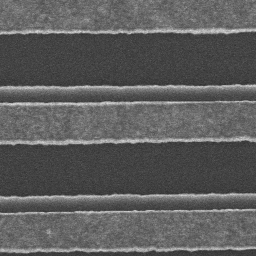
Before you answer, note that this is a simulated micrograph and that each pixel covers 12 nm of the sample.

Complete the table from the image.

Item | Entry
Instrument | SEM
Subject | lines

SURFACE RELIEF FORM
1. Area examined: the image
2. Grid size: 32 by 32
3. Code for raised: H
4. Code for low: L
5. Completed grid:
HHHHHHHHHHHHHHHHHHHHHHHHHHHHHHHH
HHHHHHHHHHHHHHHHHHHHHHHHHHHHHHHH
HHHHHHHHHHHHHHHHHHHHHHHHHHHHHHHH
HHHHHHHHHHHHHHHHHHHHHHHHHHHHHHHH
LLLLLLLLLLLLLLLLLLLLLLLLLLLLLLLL
LLLLLLLLLLLLLLLLLLLLLLLLLLLLLLLL
LLLLLLLLLLLLLLLLLLLLLLLLLLLLLLLL
LLLLLLLLLLLLLLLLLLLLLLLLLLLLLLLL
LLLLLLLLLLLLLLLLLLLLLLLLLLLLLLLL
LLLLLLLLLLLLLLLLLLLLLLLLLLLLLLLL
LLLLLLLLLLLLLLLLLLLLLLLLLLLLLLLL
HHHHHHHHHHHHHHHHHHHHHHHHHHHHHHHH
HHHHHHHHHHHHHHHHHHHHHHHHHHHHHHHH
HHHHHHHHHHHHHHHHHHHHHHHHHHHHHHHH
HHHHHHHHHHHHHHHHHHHHHHHHHHHHHHHH
HHHHHHHHHHHHHHHHHHHHHHHHHHHHHHHH
HHHHHHHHHHHHHHHHHHHHHHHHHHHHHHHH
HHHHHHHHHHHHHHHHHHHHHHHHHHHHHHLH
LLLLLLLLLLLLLLLLLLLLLLLLLLLLLLLL
LLLLLLLLLLLLLLLLLLLLLLLLLLLLLLLL
LLLLLLLLLLLLLLLLLLLLLLLLLLLLLLLL
LLLLLLLLLLLLLLLLLLLLLLLLLLLLLLLL
LLLLLLLLLLLLLLLLLLLLLLLLLLLLLLLL
LLLLLLLLLLLLLLLLLLLLLLLLLLLLLLLL
LLLLLLLLLLLHLHHHHHHHHHHHHHHHHHHH
HHHHHHHHHHHHHHHHHHHHHHHHHHHHHHHH
HHHHHHHHHHHHHHHHHHHHHHHHHHHHHHHH
HHHHHHHHHHHHHHHHHHHHHHHHHHHHHHHH
HHHHHHHHHHHHHHHHHHHHHHHHHHHHHHHH
HHHHHHHHHHHHHHHHHHHHHHHHHHHHHHHH
HHHHHHHHHHHHHHHHHHHHHHHHHHHHHHHH
LLLLLLLLLLLLLLLLLLLLLLLLLLLLLLLL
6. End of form